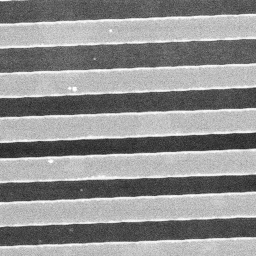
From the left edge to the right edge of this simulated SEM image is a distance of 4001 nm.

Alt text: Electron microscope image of lines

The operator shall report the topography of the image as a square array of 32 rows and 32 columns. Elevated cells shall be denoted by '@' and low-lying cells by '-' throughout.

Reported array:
--------------------------------
--------------------------------
------------@@@@@@@@@@@@@@@@@@@@
@@@@@@@@@@@@@@@@@@@@@@@@@@@@@@@@
@@@@@@@@@@@@@@@@@@@@@@@@@@@@@@@@
@@@@@@@@@@@@@-------------------
--------------------------------
--------------------------------
-------------------@@@@@@@@@@@@@
@@@@@@@@@@@@@@@@@@@@@@@@@@@@@@@@
@@@@@@@@@@@@@@@@@@@@@@@@@@@@@@@@
@@@@@@@@@@@@@@@@----------------
--------------------------------
--------------------------------
-----@@@@@@@@@@@@@@@@@@@@@@@@@@@
@@@@@@@@@@@@@@@@@@@@@@@@@@@@@@@@
@@@@@@@@@@@@@@@@@@@@@@@@@@@@@@@@
@@@@@@@@------------------------
--------------------------------
----------@@@@@@@@@@@@@@@@@@@@@@
@@@@@@@@@@@@@@@@@@@@@@@@@@@@@@@@
@@@@@@@@@@@@@@@@@@@@@@@@@@@@@@@@
@@@@@@@@------------------------
--------------------------------
-------------------@@@@@@@@@@@@@
@@@@@@@@@@@@@@@@@@@@@@@@@@@@@@@@
@@@@@@@@@@@@@@@@@@@@@@@@@@@@@@@@
@@@@@@@@@@@@@@@@@@@@@-----------
--------------------------------
--------------------------------
-----------@@@@@@@@@@@@@@@@@@@@@
@@@@@@@@@@@@@@@@@@@@@@@@@@@@@@@@